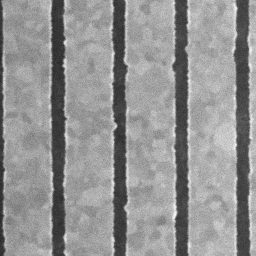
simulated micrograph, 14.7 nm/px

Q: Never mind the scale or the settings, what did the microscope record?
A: one or a few lines or trenches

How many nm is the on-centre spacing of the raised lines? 904